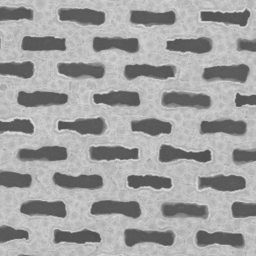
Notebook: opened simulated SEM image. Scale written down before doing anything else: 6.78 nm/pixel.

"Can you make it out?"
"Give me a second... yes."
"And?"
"a regular array of holes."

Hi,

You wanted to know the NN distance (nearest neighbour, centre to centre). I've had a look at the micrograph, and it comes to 293 nm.